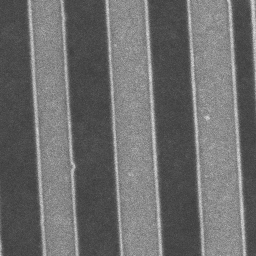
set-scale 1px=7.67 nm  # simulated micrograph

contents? one or a few lines or trenches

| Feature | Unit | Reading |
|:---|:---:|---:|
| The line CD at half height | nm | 334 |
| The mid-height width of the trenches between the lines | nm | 297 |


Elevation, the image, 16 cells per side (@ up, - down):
@@--@@@--@@@--@@
@@--@@@--@@@--@@
@@--@@@--@@@--@@
@@--@@@--@@@---@
@@--@@@--@@@---@
@@--@@@--@@@---@
@@--@@@--@@@---@
@@--@@@---@@---@
@@--@@@---@@---@
@@--@@@---@@---@
@@---@@---@@---@
@@@--@@---@@---@
@@@--@@---@@@--@
@@@--@@---@@@--@
@@@--@@@--@@@--@
@@@--@@@--@@@--@